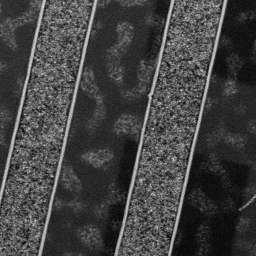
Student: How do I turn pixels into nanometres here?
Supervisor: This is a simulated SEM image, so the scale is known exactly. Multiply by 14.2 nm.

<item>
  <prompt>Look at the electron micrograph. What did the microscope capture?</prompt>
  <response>one or a few lines or trenches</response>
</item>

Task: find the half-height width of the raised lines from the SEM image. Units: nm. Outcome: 737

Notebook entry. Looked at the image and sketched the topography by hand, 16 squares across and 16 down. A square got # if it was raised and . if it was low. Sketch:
...###.....###..
..####....####..
..###.....####..
..###.....###...
..###.....###...
..###.....###...
.####....####...
.###.....###....
.###.....###....
.###.....###....
####....####....
###.....####....
###.....###.....
###.....###.....
###.....###.....
###....####.....